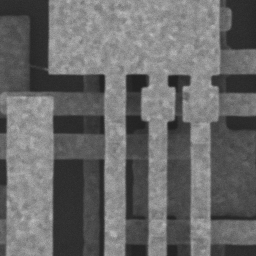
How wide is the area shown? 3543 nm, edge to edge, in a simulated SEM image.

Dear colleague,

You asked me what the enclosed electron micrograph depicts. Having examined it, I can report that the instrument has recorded wiring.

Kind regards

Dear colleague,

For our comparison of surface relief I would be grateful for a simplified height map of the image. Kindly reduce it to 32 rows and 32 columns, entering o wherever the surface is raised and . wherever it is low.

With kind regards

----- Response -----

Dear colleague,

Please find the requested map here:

......oooooooooooooooooooooo....
......ooooooooooooooooooooooo...
......ooooooooooooooooooooooo...
......ooooooooooooooooooooooo...
......ooooooooooooooooooooo.....
......ooooooooooooooooooooo.....
......oooooooooooooooooooooooooo
......oooooooooooooooooooooooooo
......oooooooooooooooooooooooooo
.............ooo..ooo..oooo.....
.............ooo...oo...ooo.....
.............ooo.ooooo.ooooo....
oooooooooooooooooooooooooooooooo
oooooooooooooooooooooooooooooooo
.oooooo......ooo.ooooo.ooooo....
.oooooo......ooo..ooo...oo......
.oooooo......ooo..ooo...oo......
oooooooooooooooooooooooooo......
oooooooooooooooooooooooooo......
oooooooooooooooooooooooooo......
.oooooo......ooo...oo...oo......
.oooooo......ooo...oo...oo......
.oooooo......ooo...oo...oo......
.oooooo......ooo...oo...oo......
.oooooo......ooo...oo...oo......
.oooooo......ooo...oo...oo......
.oooooo......ooo...oo...oo......
ooooooo......oooooooo..oooo.....
ooooooo......ooooooooooooooooooo
ooooooo......ooooooooooooooooooo
ooooooo......ooo..ooo..oooo..ooo
.oooooo......ooo...oo...oo......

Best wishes